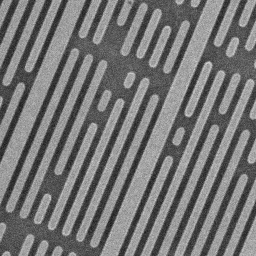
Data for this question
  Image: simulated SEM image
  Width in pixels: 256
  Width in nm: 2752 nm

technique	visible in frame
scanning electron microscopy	groups of lines, slits or small figures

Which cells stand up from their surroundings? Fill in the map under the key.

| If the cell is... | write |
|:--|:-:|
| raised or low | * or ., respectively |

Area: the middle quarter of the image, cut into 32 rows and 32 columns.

**..**...**...........*..**..***
**..**..**...............**..***
*...**..**......**..........****
*..**..**.......**..........****
*..**..**......**..**......****.
..**...**......**..**......****.
..**..**..........**.......****.
..**..**..*.......**......****..
.**..**..**.......**..*...****..
.**..**..**..**..**..**..****..*
**..**...**..**..**..**..****..*
**..**...*..**..**...**.*****.**
*...**......**..**..**..****..**
*..**......**...**..**..****....
*..**......**..**..**..****.....
..**...*...**..**..**..****.....
..**..**..**..**..**..****..**..
..*...**..**..**..**..****..**..
.**..**..**..**...**..****..*...
.**..**..**..**..**..****..**..*
**..**..***..**..**..****......*
**..**..**..**..**..****......**
*...*...**..**..**..****......**
*..**..**..**...**.****...*...**
*..**..**..**..**..****..**..**.
..**..**...**..**..****..**..**.
..**..**..**..**..****..**..**..
.**...**..**..**..****..**..**..
.**..**..**..**..****..**..**...
.**..**..**..**..****..**..**..*
**..**..**...**.*****.**...**..*
**..**..**..**..****..**..**..**